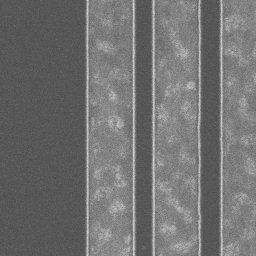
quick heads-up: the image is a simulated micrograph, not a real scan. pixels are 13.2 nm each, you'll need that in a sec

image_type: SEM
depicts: one or a few lines or trenches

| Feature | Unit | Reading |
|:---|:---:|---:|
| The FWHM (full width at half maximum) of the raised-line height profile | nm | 285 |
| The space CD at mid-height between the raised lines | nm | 604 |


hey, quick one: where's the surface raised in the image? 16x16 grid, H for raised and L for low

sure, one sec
HHHHHLLLHHLLHHLL
HHHHHLLLHHLLHHLL
HHHHHLLLHHLLHHLL
HHHHHLLLHHLLHHLL
HHHHHLLLHHLLHHLL
HHHHHLLLHHLLHHLL
HHHHHLLLHHLLHHLL
HHHHHLLLHHLLHHLL
HHHHHLLLHHLLHHLL
HHHHHLLLHHLLHHLL
HHHHHLLLHHLLHHLL
HHHHHLLLHHLLHHLL
HHHHHLLLHHLLHHLL
HHHHHLLLHHLLHHLL
HHHHHLLLHHLLHHLL
HHHHHLLLHHLLHHLL